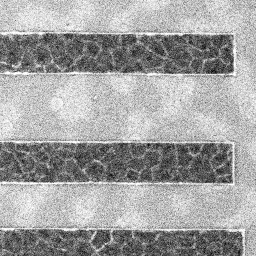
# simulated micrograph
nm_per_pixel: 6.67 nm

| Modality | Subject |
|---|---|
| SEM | one or a few lines or trenches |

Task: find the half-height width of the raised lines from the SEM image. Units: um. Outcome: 0.277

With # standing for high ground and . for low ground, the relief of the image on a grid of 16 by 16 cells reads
................
................
###############.
###############.
##############..
................
................
................
................
###############.
###############.
................
................
................
###############.
###############.